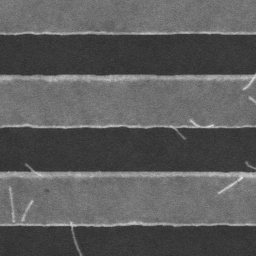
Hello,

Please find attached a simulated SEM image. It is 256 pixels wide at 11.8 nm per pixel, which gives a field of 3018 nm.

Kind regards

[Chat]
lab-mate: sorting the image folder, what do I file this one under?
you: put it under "lines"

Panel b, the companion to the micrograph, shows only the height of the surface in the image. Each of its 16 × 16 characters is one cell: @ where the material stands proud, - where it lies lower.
@@@@@@@@@@@@@@@@
@@@@@@@@@@@@@@@@
----------------
----------------
----------------
@@@@@@@@@@@@@@@@
@@@@@@@@@@@@@@@@
@@@@@@@@@@@@@@@@
----------------
----------------
----------------
@@@@@@@@@@@@@@@@
@@@@@@@@@@@@@@@@
@@@@@@@@@@@@@@@@
----------------
----------------